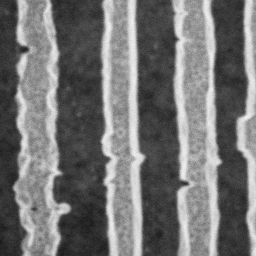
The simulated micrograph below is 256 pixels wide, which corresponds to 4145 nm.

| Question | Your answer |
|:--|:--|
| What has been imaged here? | one or a few lines or trenches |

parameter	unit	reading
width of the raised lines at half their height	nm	455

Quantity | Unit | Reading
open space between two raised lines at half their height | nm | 765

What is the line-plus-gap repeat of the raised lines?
1.28 um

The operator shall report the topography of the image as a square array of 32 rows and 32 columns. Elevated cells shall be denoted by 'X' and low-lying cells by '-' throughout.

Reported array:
---XXX--------XX------XXXX-----X
---XXX--------XX-------XXX-----X
---XXX--------XX------XXXX-----X
---XXX--------XX------XXXX-----X
---XXX-------XXXX-----XXXX-----X
---XXXX------XXXX------XXX-----X
----XXX------XXXX------XXX-----X
---XXXX------XXXX-----XXXX-----X
---XXX-------XXXX-----XXXX-----X
---XXXX------XXXX------XXX-----X
--XXXXX------XXXX-----XXXX------
--XXXX-------XXXX-----XXXX------
---XXX-------XXXX------XXX-----X
---XXX-------XXXX------XXX-----X
---XXX--------XXX------XXX-----X
---XXX--------XXX------XXX----XX
---XXX--------XXX------XXX----XX
---XXXX------XXXX------XXX----XX
---XXXX------XXXX------XXX----XX
---XXXX-------XXX------XXX-----X
---XXXX-------XXX------XXX------
---XXXX-------XXX------XXX------
--XXXX-------XXXX------XXX------
--XXXX--------XXX------XXXX-----
---XXX--------XXX------XXXX-----
---XXX--------XXX------XXXX-----
---XXXX-------XXX------XXXX-----
---XXXX-------XXX------XXXX----X
----XXX-------XXX------XXXX-----
----XXX-------XXX------XXXX-----
----XXX-------XXX------XXXX-----
----XXX-------XXX------XXXX-----